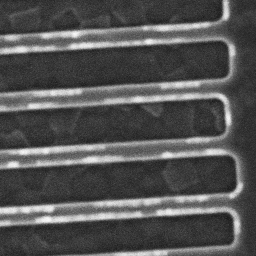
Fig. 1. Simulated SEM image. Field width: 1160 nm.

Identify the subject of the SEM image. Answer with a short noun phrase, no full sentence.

parallel lines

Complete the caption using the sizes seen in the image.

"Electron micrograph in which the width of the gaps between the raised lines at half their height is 179 nm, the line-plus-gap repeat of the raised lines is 0.259 micrometres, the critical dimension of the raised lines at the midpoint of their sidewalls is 78.5 nanometres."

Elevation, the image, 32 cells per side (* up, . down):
............................****
............................****
...........................*****
.................***************
********************************
*******************.........****
***..........................***
.............................***
.............................***
............................****
...................*.***********
...*****************************
********************........****
*****.......................****
............................****
............................****
............................****
......................**********
.......*************************
************************.....***
********......................**
..............................**
..............................**
..............................**
.........................*******
.........***********************
**************************..****
**********...................***
.............................***
.............................***
.............................***
..................**************